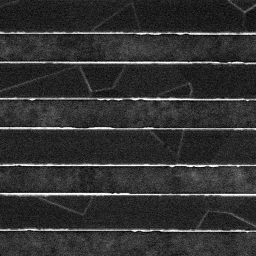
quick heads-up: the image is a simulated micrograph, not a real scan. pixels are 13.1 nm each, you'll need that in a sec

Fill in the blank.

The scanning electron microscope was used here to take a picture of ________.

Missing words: lines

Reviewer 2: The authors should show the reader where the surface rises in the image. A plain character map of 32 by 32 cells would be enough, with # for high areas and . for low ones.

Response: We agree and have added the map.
################################
################################
################################
################################
................................
................................
................................
................................
################################
################################
################################
################################
................................
................................
................................
................................
################################
################################
################################
################################
################################
................................
................................
................................
################################
################################
################################
################################
################################
................................
................................
................................